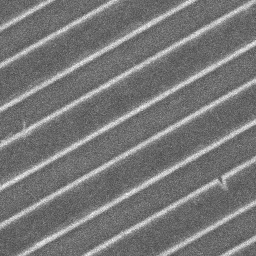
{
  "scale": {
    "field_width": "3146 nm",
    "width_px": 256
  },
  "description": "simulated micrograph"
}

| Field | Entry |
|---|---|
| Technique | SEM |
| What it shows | one or a few lines or trenches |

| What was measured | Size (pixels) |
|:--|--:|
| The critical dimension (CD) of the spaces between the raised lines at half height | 32.3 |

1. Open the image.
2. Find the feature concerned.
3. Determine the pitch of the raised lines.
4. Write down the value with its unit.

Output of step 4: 0.85 microns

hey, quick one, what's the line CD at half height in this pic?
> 456 nm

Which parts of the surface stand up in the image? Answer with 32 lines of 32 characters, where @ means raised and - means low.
@@@@@--------@@@@@@@@@@--------@
@@@@--------@@@@@@@@@--------@@@
@@--------@@@@@@@@@@--------@@@@
--------@@@@@@@@@@--------@@@@@@
------@@@@@@@@@@--------@@@@@@@@
-----@@@@@@@@@--------@@@@@@@@@@
---@@@@@@@@@@--------@@@@@@@@@--
-@@@@@@@@@@--------@@@@@@@@@----
@@@@@@@@@--------@@@@@@@@@------
@@@@@@@--------@@@@@@@@@@-------
@@@@@@--------@@@@@@@@@--------@
@@@@--------@@@@@@@@@--------@@@
@@--------@@@@@@@@@---------@@@@
--------@@@@@@@@@@--------@@@@@@
-------@@@@@@@@@--------@@@@@@@@
-----@@@@@@@@@--------@@@@@@@@@-
---@@@@@@@@@---------@@@@@@@@@--
-@@@@@@@@@@--------@@@@@@@@@----
@@@@@@@@@--------@@@@@@@@@------
@@@@@@@--------@@@@@@@@@--------
@@@@@---------@@@@@@@@@--------@
@@@@--------@@@@@@@@@--------@@@
@@--------@@@@@@@@@---------@@@@
--------@@@@@@@@@---------@@@@@@
-------@@@@@@@@@--------@@@@@@@@
-----@@@@@@@@@--------@@@@@@@@@@
---@@@@@@@@@--------@@@@@@@@@@--
-@@@@@@@@@---------@@@@@@@@@----
@@@@@@@@@--------@@@@@@@@@------
@@@@@@@--------@@@@@@@@@@-------
@@@@@--------@@@@@@@@@@--------@
@@@---------@@@@@@@@@--------@@@